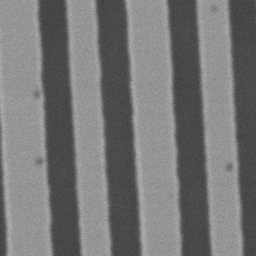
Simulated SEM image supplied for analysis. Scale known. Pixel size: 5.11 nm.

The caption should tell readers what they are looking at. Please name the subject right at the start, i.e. lines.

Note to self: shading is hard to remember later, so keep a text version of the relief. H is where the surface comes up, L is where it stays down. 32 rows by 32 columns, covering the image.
HHHHHLLLHHHHLLLLHHHHHLLLLHHHLLLL
HHHHHLLLHHHHLLLLHHHHHLLLLHHHHLLL
HHHHHLLLHHHHLLLLHHHHHLLLLHHHHLLL
HHHHHLLLLHHHLLLLHHHHHLLLLHHHHLLL
HHHHHLLLLHHHLLLLHHHHHLLLLHHHHLLL
HHHHHLLLLHHHLLLLHHHHHLLLLHHHHLLL
HHHHHLLLLHHHLLLLHHHHHLLLLHHHHLLL
HHHHHLLLLHHHLLLLHHHHHLLLLHHHHLLL
HHHHHLLLLHHHLLLLHHHHHLLLLHHHHLLL
HHHHHLLLLHHHHLLLHHHHHLLLLHHHHLLL
HHHHHLLLLHHHLLLLHHHHHLLLLHHHHLLL
HHHHHLLLLHHHHLLLHHHHHHLLLHHHHLLL
HHHHHLLLLHHHHLLLLHHHHHLLLHHHHLLL
HHHHHLLLLHHHHLLLLHHHHHLLLHHHHLLL
HHHHHLLLLHHHHLLLLHHHHHLLLHHHHLLL
HHHHHHLLLHHHHLLLLHHHHHLLLLHHHLLL
HHHHHHLLLHHHHLLLLHHHHHLLLLHHHLLL
HHHHHHLLLHHHHLLLLHHHHHLLLLHHHLLL
HHHHHHLLLHHHHLLLLHHHHHLLLLHHHHLL
HHHHHHLLLLHHHLLLLHHHHHLLLLHHHHLL
HHHHHHLLLLHHHLLLLHHHHHLLLLHHHHLL
HHHHHHLLLLHHHLLLLHHHHHLLLLHHHHLL
HHHHHHLLLLHHHLLLLHHHHHLLLLHHHHLL
HHHHHHLLLLHHHLLLLHHHHHLLLLHHHHLL
LHHHHHLLLLHHHLLLLHHHHHLLLLHHHHLL
LHHHHHLLLLHHHLLLLHHHHHLLLLHHHHLL
LHHHHHLLLLHHHHLLLHHHHHLLLLHHHHLL
LHHHHHLLLLHHHHLLLHHHHHLLLLHHHHLL
LHHHHHLLLLHHHHLLLLHHHHLLLLHHHHLL
LHHHHHLLLLHHHHLLLLHHHHHLLLHHHHLL
LHHHHHLLLLHHHHLLLLHHHHHLLLHHHHLL
LHHHHHLLLLHHHHLLLLHHHHHLLLHHHHLL